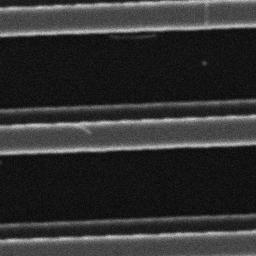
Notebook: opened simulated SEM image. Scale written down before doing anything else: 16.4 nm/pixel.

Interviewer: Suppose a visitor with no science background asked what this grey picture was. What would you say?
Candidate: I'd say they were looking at lines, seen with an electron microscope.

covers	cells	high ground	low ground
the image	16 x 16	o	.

oooooooooooooooo
oooooooooooooooo
................
................
................
................
............oooo
oooooooooooooooo
oooooooooooooooo
ooo.............
................
................
................
...............o
oooooooooooooooo
oooooooooooooooo